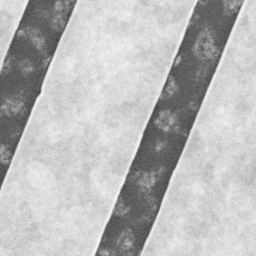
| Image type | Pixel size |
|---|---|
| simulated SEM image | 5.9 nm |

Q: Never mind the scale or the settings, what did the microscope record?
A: one or a few lines or trenches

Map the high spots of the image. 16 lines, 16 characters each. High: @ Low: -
@@---@@@@@@@---@
@---@@@@@@@@---@
@---@@@@@@@---@@
---@@@@@@@@---@@
---@@@@@@@@---@@
---@@@@@@@---@@@
--@@@@@@@@---@@@
--@@@@@@@---@@@@
-@@@@@@@@---@@@@
-@@@@@@@---@@@@@
-@@@@@@@---@@@@@
@@@@@@@@---@@@@@
@@@@@@@---@@@@@@
@@@@@@@---@@@@@@
@@@@@@---@@@@@@@
@@@@@@---@@@@@@@